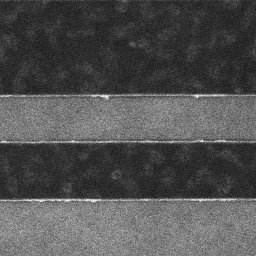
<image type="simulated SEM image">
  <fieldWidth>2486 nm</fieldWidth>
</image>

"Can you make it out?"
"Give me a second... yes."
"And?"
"one or a few lines or trenches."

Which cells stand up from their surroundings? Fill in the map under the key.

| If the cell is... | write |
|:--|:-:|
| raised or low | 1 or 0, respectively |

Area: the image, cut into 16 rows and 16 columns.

1111111111111111
1111111111111111
1111111111111111
1111111111111111
1111111111111111
1111111111111111
0000000000000000
0000000000000000
0000000000000000
1111111111111111
1111111111111111
1111111111111111
1111111111001110
0000000000000000
0000000000000000
0000000000000000